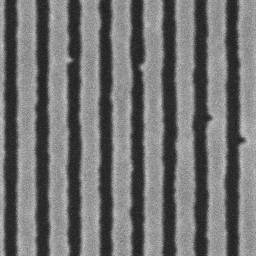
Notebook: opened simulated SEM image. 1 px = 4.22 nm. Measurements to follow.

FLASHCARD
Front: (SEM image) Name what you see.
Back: parallel lines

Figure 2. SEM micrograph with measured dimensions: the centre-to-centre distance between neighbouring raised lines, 134 nm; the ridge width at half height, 71.7 nm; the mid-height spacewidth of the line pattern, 14.2 px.